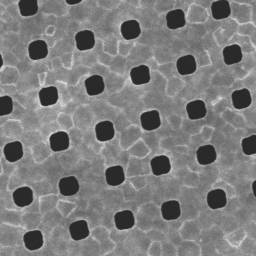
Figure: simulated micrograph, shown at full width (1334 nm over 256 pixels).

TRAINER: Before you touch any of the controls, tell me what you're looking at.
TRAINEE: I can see a regular array of holes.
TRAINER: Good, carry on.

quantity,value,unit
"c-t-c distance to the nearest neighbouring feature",238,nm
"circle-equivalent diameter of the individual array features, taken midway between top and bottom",106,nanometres